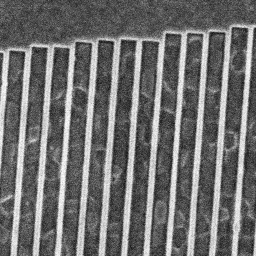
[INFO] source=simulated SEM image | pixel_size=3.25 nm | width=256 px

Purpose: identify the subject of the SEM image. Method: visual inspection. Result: parallel lines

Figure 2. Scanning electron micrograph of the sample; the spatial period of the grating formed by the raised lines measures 72.5 nm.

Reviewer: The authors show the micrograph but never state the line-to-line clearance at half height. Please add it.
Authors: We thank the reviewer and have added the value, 54.2 nanometres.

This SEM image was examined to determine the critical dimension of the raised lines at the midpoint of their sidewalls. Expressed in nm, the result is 17.8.